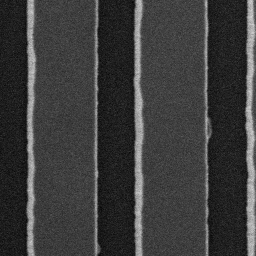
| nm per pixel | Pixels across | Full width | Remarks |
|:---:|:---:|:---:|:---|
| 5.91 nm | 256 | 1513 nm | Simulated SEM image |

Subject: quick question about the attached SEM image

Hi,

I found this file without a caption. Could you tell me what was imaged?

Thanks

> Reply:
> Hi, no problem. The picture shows lines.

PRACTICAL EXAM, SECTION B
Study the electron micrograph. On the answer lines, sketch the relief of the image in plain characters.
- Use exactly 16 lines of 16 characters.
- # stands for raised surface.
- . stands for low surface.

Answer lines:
..####...####...
..####...####...
..####...####...
..####...####...
..####...####...
..####...####...
..####...####...
..####...####...
..####...####...
..####...####...
..####...####...
..####...####...
..####...####...
..####...####...
..####...####...
..####...####...